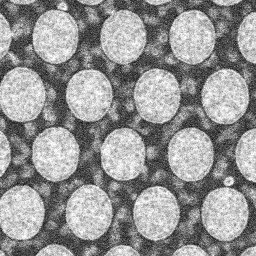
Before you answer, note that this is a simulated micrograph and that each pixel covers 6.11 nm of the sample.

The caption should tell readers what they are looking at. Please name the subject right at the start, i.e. a regular array of raised bodies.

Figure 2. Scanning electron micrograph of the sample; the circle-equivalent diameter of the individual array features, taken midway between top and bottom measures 297 nm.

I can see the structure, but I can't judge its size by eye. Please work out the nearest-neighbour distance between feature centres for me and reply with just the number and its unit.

412 nm